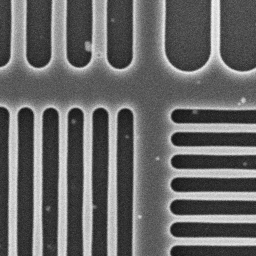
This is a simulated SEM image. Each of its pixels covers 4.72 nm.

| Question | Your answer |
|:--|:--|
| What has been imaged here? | groups of lines, slits or small figures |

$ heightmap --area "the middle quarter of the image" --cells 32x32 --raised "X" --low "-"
XX----XXXXXX----XXXXXXXXXXX-----
XXXXXXXXXXXXXXXXXXXXXXXXXXXXX---
XXXXXXXXXXXXXXXXXXXXXXXXXXXXXXXX
XXXXXXXXXXXXXXXXXXXXXXXXXXXXXXXX
XXXXXXXXXXXXXXXXXXXXXXXXXXXXXXXX
XXXXXXXXXXXXXXXXXXXXXXXXXXXXXXXX
XXXXXXXXXXXXXXXXXXXXXXXXXXXXXXXX
XXXXXXXXXXXXXXXXXXXXXXXXXXXXXXXX
XXXXXXXXXXXXXXXXXXXXXXXXXXXXXXXX
XXXXXXXXXXXXXXXXXXXXXXXXXXXXXXXX
XXXXXXXXXXXXXXXXXXXXXXXXXXXXXXXX
X----XXX---XXX---XXXXXXXXXX-----
X----XX----XX----XXXXXXXXXX-----
X----XX----XX----XXXXXXXXXX-----
X----XX----XX----XXXXXXXXXX-----
X----XX----XX-----XXXXXXXXXXXXXX
X----XX----XX-----XXXXXXXXXXXXXX
X----XX----XX-----XXXXXXXXX-----
X----XX----XX-----XXXXXXXXX-----
X----XX----XX-----XXXXXXXXX-----
X----XX----XX-----XXXXXXXXXX----
X----XX----XX-----XXXXXXXXXXXXXX
X----XX----XX-----XXXXXXXXXX----
X----XX----XX-----XXXXXXXXX-----
X----XX----XX-----XXXXXXXX------
X----XX----XX-----XXXXXXXXX-----
X----XX----XX-----XXXXXXXXXXXXXX
X----XX----XX-----XXXXXXXXXXXXXX
X----XX----XX----XXXXXXXXXX-----
X----XX----XX----XXXXXXXXXX-----
X----XX----XX----XXXXXXXXX------
X----XX----XX----XXXXXXXXXX-----